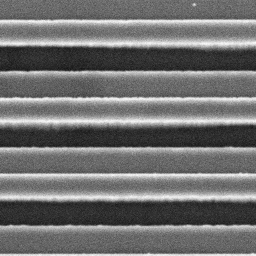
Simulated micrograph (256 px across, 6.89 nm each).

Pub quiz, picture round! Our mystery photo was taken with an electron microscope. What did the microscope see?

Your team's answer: lines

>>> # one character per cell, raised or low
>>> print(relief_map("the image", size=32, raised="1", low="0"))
11111111111111111111111111111111
11111111111111111111111111111111
11111111111111111111111111111111
11111111111111111111111111111111
11111111111111111111111111111111
11111111111111111111111111111111
00000000000000000000000000000000
00000000000000000000000000000000
00000000000000000000000000000000
11111111111111111111111111111111
11111111111111111111111111111111
11111111111111111111111111111111
11111111111111111111111111111111
11111111111111111111111111111111
11111111111111111111111111111111
00000000000000000000000000000000
00000000000000000000000000000000
00000000000000000000000000000000
00000000000000000000000000000000
11111111111111111111111111111111
11111111111111111111111111111111
11111111111111111111111111111111
11111111111111111111111111111111
11111111111111111111111111111111
11111111111111111111111111111111
00000000000000000000000000000000
00000000000000000000000000000000
00000000000000000000000000000000
11111111111111111111111111111111
11111111111111111111111111111111
11111111111111111111111111111111
11111111111111111111111111111111